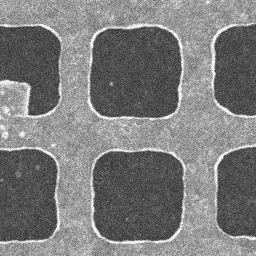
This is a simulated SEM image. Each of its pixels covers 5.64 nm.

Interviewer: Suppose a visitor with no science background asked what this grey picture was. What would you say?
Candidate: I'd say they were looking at holes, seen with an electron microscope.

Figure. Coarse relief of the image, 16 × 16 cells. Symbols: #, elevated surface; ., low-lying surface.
################
###############.
....##.....##...
....##.....##...
....##.....##...
##..##.....##...
##..##.....###..
################
################
...####...####..
....##.....###..
....##......##..
...###......##..
....##.....###..
...###.....###..
################